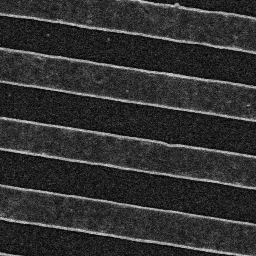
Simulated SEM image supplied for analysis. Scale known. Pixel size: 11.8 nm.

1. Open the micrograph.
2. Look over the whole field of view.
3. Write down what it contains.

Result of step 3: one or a few lines or trenches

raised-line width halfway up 32.7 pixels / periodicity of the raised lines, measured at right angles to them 67.7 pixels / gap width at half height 416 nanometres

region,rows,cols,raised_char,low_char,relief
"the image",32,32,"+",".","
+++++++++++++++++++.............
++++++++++++++++++++++++++......
.....+++++++++++++++++++++++++++
...........+++++++++++++++++++++
...................+++++++++++++
.........................+++++++
+++............................+
++++++++++......................
++++++++++++++++................
++++++++++++++++++++++..........
..+++++++++++++++++++++++++++...
........++++++++++++++++++++++++
...............+++++++++++++++++
.....................+++++++++++
............................++++
+++++...........................
++++++++++++....................
++++++++++++++++++..............
+++++++++++++++++++++++++.......
.....++++++++++++++++++++++++++.
............++++++++++++++++++++
..................++++++++++++++
.........................+++++++
++.............................+
+++++++++.......................
+++++++++++++++.................
++++++++++++++++++++++..........
.+++++++++++++++++++++++++++....
........++++++++++++++++++++++++
..............++++++++++++++++++
.....................+++++++++++
...........................+++++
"